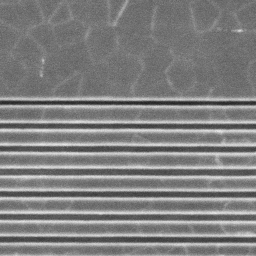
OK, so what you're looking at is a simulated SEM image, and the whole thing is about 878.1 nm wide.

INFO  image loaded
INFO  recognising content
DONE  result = parallel lines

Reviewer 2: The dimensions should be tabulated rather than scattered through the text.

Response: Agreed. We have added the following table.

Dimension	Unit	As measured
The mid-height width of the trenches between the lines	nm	23.2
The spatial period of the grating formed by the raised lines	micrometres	0.0785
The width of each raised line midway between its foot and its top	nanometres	54.9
